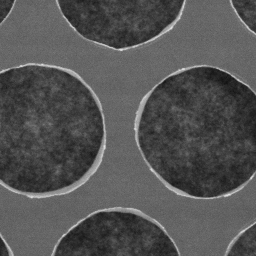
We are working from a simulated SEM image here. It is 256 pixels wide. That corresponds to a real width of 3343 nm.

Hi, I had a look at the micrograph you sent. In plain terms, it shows holes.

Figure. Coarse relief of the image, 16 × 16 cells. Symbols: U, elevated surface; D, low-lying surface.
DUUUDDDDDDDUUUUD
UUUUDDDDDDDUUUUD
UUUUUUDDDUUUUUUU
UUUUUUUUUUUUUUUU
DDDDUUUUUUUDDDUU
DDDDDUUUUUDDDDDD
DDDDDDUUUDDDDDDD
DDDDDDUUUDDDDDDD
DDDDDDUUUDDDDDDD
DDDDDDUUUDDDDDDD
DDDDDDUUUUDDDDDD
DDDDDUUUUUUDDDDU
UUUUUUUUUUUUUUUU
UUUUUUDDDUUUUUUU
UUUUDDDDDDUUUUUD
UUUUDDDDDDDUUUDD